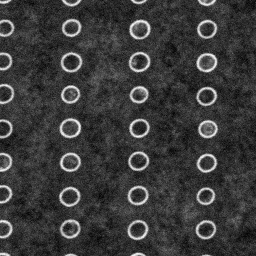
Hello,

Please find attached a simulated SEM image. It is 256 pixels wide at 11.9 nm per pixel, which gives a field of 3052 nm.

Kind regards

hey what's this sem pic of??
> a regular array of raised bodies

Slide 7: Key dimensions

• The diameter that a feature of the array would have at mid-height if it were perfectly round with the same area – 216 nm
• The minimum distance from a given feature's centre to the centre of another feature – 32.9 pixels